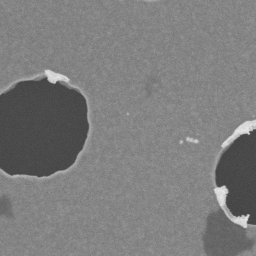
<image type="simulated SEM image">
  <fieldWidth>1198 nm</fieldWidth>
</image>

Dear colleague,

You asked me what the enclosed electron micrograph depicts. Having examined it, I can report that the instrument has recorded holes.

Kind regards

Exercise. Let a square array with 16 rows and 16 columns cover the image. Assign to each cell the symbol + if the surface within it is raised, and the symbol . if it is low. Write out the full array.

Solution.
++++++++++++++++
++++++++++++++++
++++++++++++++++
++++++++++++++++
++++++++++++++++
+....+++++++++++
.....+++++++++++
.....+++++++++++
.....++++++++++.
.....+++++++++..
....++++++++++..
++++++++++++++..
++++++++++++++..
+++++++++++++++.
++++++++++++++++
++++++++++++++++